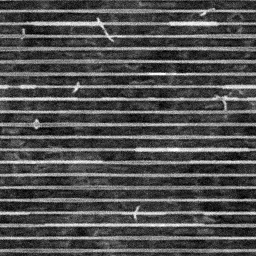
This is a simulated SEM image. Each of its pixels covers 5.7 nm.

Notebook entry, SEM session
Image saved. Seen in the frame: parallel lines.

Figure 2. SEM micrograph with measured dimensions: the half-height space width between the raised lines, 56.2 nm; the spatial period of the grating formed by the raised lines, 71.8 nanometers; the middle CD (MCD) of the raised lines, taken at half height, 11.4 nm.